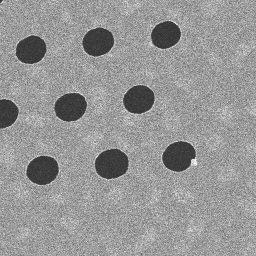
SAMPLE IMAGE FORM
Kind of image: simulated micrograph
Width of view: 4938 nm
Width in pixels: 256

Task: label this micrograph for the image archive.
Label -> a regular array of holes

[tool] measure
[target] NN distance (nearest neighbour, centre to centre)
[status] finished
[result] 1310 nm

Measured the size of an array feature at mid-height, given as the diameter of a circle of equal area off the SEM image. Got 0.59 µm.